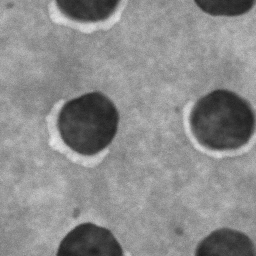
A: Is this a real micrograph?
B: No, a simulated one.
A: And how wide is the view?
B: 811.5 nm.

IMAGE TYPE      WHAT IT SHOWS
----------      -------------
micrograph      holes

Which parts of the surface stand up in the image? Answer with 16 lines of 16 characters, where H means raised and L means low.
HHHHLLLHHHHHHLLL
HHHHHHHHHHHHHHHH
HHHHHHHHHHHHHHHH
HHHHHHHHHHHHHHHH
HHHHHHHHHHHHHHHH
HHHHHHHHHHHHHHHH
HHHHLLLHHHHHLLLH
HHHHLLLHHHHHLLLL
HHHHLLLHHHHHLLLL
HHHHHLHHHHHHHHHH
HHHHHHHHHHHHHHHH
HHHHHHHHHHHHHHHH
HHHHHHHHHHHHHHHH
HHHHHHHHHHHHHHHH
HHHHLLLHHHHHHLLH
HHHHLLLLHHHHLLLL